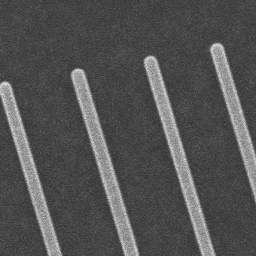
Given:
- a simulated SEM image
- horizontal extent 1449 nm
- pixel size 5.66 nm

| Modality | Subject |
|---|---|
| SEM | one or a few lines or trenches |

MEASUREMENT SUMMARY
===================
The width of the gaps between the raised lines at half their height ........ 347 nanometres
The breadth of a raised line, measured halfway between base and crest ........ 0.0643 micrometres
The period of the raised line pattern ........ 406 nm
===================